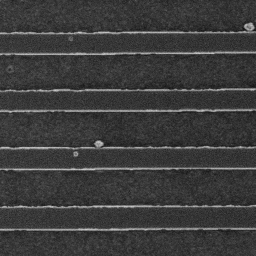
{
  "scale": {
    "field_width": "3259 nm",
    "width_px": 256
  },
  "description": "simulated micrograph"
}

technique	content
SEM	lines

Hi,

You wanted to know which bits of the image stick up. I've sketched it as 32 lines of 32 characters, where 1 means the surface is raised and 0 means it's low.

00000000000000000000000000000000
00000000000000000000000000000000
00000000000000000000000000000000
00000000000000000000000000000001
11111111111111111111111111111111
11111111111111111111111111111111
11111111111111111111111111111100
00000000000000000000000000000000
00000000000000000000000000000000
00000000000000000000000000000000
00000000000000000000000000000000
11111111111111111111111111111111
11111111111111111111111111111111
11111111111111111111111111111111
00000000000000000000000000000000
00000000000000000000000000000000
00000000000000000000000000000000
00000000000000000000000000000000
00000000000010001011110111111111
11111111111111111111111111111111
11111111111111111111111111111111
00000000000000000000000000000000
00000000000000000000000000000000
00000000000000000000000000000000
00000000000000000000000000000000
00000000000000000000000000000000
11111111111111111111111111111111
11111111111111111111111111111111
11111111111111111111111111111111
00000000000000000000000000000000
00000000000000000000000000000000
00000000000000000000000000000000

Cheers